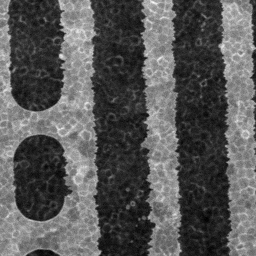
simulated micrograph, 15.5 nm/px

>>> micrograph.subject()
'one or a few lines or trenches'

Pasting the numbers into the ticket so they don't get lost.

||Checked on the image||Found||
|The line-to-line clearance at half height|784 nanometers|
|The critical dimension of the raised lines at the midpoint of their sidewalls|432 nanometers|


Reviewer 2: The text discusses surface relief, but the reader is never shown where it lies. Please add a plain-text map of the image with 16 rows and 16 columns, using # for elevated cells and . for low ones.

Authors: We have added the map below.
....##...##...##
....##...##...##
#...##...##...##
#...##...##...##
#...##...##...##
#...##...##...##
#..###...##...##
######...##...##
##.###...##...##
#...##...##...##
#...##...##...##
#...##...##...##
#...##...##...##
##..##...##...##
######....#...##
######...##...##